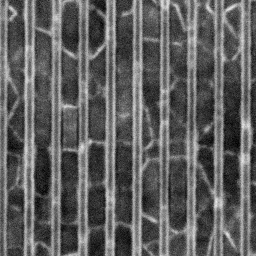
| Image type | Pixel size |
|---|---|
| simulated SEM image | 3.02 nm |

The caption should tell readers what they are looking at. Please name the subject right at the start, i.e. parallel lines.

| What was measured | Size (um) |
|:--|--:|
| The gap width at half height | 0.0586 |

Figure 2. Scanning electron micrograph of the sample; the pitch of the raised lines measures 81.8 nm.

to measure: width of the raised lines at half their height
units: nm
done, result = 23.4